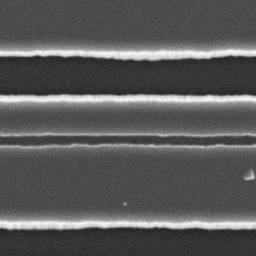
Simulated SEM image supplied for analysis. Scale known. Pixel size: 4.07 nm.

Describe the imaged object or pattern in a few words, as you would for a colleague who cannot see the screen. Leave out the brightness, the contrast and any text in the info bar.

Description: lines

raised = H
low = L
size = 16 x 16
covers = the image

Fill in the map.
HHHHHHHHHHHHHHHH
HHHHHHHHHHHHHHHH
HHHHHHHHHHHHHHHH
LLLLLLLHHHLLLLLL
LLLLLLLLLLLLLLLL
LLLLLLLLLLLLLLLL
HHHHHHHHHHHHHHHH
HHHHHHHHHHHHHHHH
HHHHHHHHHHHHHHHH
HHHHHHHHHHHHHHHH
HHHHHHHHHHHHHHHH
HHHHHHHHHHHHHHHH
HHHHHHHHHHHHHHHH
HHHHHHHHHHHHHHHH
LLLLLLLLLLLLLLLL
LLLLLLLLLLLLLLLL